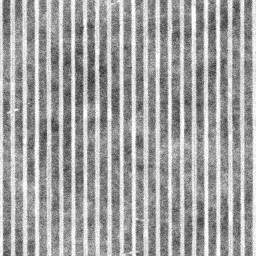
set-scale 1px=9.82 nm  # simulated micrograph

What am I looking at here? parallel lines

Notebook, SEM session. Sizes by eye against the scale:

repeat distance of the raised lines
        119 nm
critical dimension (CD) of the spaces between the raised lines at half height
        90.8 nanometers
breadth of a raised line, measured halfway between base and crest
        24.6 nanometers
